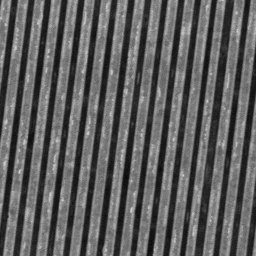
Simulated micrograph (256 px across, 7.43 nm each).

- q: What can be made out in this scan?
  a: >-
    parallel lines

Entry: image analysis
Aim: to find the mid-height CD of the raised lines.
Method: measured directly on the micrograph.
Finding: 60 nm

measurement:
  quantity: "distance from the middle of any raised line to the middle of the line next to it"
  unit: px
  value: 16.5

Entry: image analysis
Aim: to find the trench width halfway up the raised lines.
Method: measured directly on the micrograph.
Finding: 60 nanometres